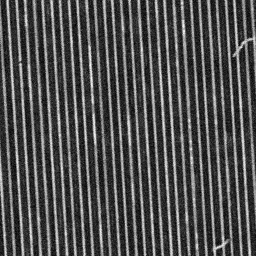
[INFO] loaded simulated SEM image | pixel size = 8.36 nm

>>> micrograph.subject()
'parallel lines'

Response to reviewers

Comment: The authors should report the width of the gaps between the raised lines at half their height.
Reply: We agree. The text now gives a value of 55.3 nm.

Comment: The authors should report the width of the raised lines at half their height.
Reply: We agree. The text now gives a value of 15.6 nm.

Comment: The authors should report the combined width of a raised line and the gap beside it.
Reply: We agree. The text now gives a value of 8.7 pixels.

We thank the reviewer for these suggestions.